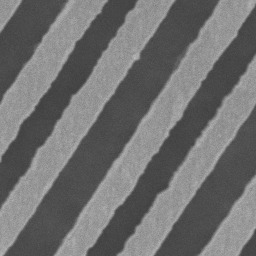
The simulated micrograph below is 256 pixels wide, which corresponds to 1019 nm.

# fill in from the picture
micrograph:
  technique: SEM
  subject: lines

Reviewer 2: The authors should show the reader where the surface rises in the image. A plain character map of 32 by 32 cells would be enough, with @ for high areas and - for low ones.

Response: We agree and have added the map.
@@------@@@@@----@@@@@-----@@@@@
@@------@@@@----@@@@@------@@@@-
@------@@@@@----@@@@------@@@@@-
------@@@@@----@@@@@-----@@@@@--
------@@@@----@@@@@------@@@@---
-----@@@@-----@@@@------@@@@@---
----@@@@@----@@@@@-----@@@@@----
----@@@@----@@@@@------@@@@-----
---@@@@@----@@@@------@@@@@----@
--@@@@@----@@@@@-----@@@@@----@@
--@@@@-----@@@@------@@@@-----@@
-@@@@@----@@@@------@@@@@----@@@
@@@@@----@@@@------@@@@@----@@@@
@@@@----@@@@@------@@@@-----@@@@
@@@@----@@@@------@@@@@----@@@@-
@@@----@@@@@------@@@@----@@@@--
@@-----@@@@------@@@@----@@@@@--
@@----@@@@------@@@@@----@@@@---
@----@@@@@------@@@@----@@@@----
----@@@@@------@@@@----@@@@@----
----@@@@------@@@@@----@@@@-----
---@@@@@------@@@@----@@@@------
---@@@@------@@@@----@@@@@------
--@@@@------@@@@@----@@@@------@
-@@@@@------@@@@----@@@@------@@
@@@@@------@@@@----@@@@------@@@
@@@@------@@@@-----@@@@------@@@
@@@@------@@@@----@@@@------@@@@
@@@------@@@@----@@@@------@@@@@
@@------@@@@-----@@@@------@@@@-
@@------@@@@----@@@@------@@@@@-
@------@@@@----@@@@------@@@@@--